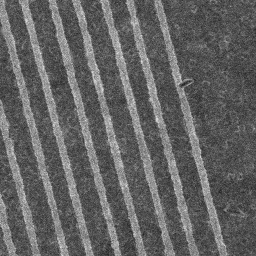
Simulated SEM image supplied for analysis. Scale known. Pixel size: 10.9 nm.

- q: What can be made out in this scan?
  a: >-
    parallel lines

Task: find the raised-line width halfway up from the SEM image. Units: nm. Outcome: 71.1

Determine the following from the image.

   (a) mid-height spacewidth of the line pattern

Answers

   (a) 191 nm